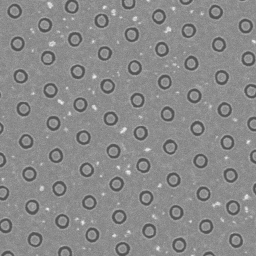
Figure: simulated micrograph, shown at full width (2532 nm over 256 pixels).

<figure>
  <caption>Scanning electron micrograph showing a regular array of ring-shaped grooves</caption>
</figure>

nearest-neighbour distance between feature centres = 0.32 um